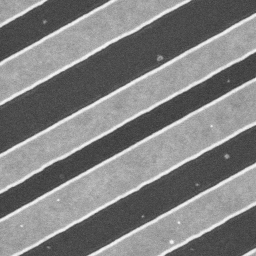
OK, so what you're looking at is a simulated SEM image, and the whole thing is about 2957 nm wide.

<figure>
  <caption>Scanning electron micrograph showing lines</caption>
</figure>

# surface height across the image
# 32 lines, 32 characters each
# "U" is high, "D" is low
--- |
UUUUUDDDDDDDDUUUUUUUUUUDDDDDDDDD
UUUDDDDDDDDUUUUUUUUUUDDDDDDDDDDD
UUDDDDDDDUUUUUUUUUUDDDDDDDDDDDUU
DDDDDDDDUUUUUUUUUUDDDDDDDDDDDUUU
DDDDDDUUUUUUUUUUDDDDDDDDDDDUUUUU
DDDDUUUUUUUUUUDDDDDDDDDDDUUUUUUU
DDUUUUUUUUUUDDDDDDDDDDDUUUUUUUUU
DUUUUUUUUUDDDDDDDDDDDDUUUUUUUUDD
UUUUUUUUDDDDDDDDDDDDUUUUUUUUDDDD
UUUUUUUDDDDDDDDDDDUUUUUUUUUDDDDD
UUUUUDDDDDDDDDDDUUUUUUUUUDDDDDUU
UUUDDDDDDDDDDDUUUUUUUUUDDDDDDUUU
UDDDDDDDDDDDUUUUUUUUUDDDDDDUUUUU
DDDDDDDDDDUUUUUUUUUDDDDDDUUUUUUU
DDDDDDDDDUUUUUUUUDDDDDDUUUUUUUUU
DDDDDDDUUUUUUUUUDDDDDUUUUUUUUUUU
DDDDDUUUUUUUUUDDDDDDUUUUUUUUUUDD
DDDUUUUUUUUUDDDDDDUUUUUUUUUUDDDD
DUUUUUUUUUDDDDDDUUUUUUUUUUUDDDDD
UUUUUUUUUDDDDDUUUUUUUUUUUDDDDDDD
UUUUUUDDDDDDUUUUUUUUUUUDDDDDDDDD
UUUUUDDDDDDUUUUUUUUUUDDDDDDDDDUU
UUUDDDDDDUUUUUUUUUUDDDDDDDDDUUUU
UDDDDDDUUUUUUUUUUUDDDDDDDDUUUUUU
DDDDDUUUUUUUUUUUDDDDDDDDUUUUUUUU
DDDUUUUUUUUUUUDDDDDDDDDUUUUUUUUU
DDUUUUUUUUUUDDDDDDDDDUUUUUUUUUDD
UUUUUUUUUUDDDDDDDDDUUUUUUUUUDDDD
UUUUUUUUUDDDDDDDDUUUUUUUUUUDDDDD
UUUUUUUDDDDDDDDUUUUUUUUUUDDDDDDD
UUUUUDDDDDDDDDUUUUUUUUUDDDDDDDDD
UUUDDDDDDDDDUUUUUUUUUDDDDDDDDDDU